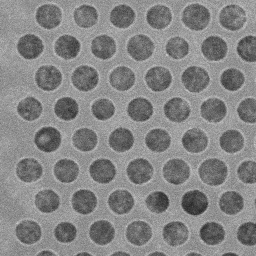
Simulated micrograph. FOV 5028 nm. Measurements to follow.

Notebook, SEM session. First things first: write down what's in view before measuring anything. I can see a regular array of holes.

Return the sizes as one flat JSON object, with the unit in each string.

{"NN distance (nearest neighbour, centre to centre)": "702 nm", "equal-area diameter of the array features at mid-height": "519 nanometers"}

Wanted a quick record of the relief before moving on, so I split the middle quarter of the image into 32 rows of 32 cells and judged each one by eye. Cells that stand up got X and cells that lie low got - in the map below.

XXXX---XXXXXXX-XXXXXXX--XXXXXXXX
XX------XXXX-----XXXX-----XXXX--
XX-------XX-------XX-------XX---
XX-------XX-------XX-------XX---
XX-------XX-------XX-------XX---
XX------XXXX-----XXXX------XXX--
XXX----XXXXXX---XXXXXX---XXXXXX-
XXXXXXXXXXXXXXXXXXXXXXXXXXXXXXXX
--XXXXXXX-XXXXXXXX---XXXXXX--XXX
---XXXX-----XXXX------XXX------X
----XXX------XXX------XXX-------
----XXX------XX--------XX-------
---XXXX------XXX------XXX------X
---XXXXX----XXXXX-----XXXX-----X
XXXXXXXXXXXXXXXXXX-XXXXXXXX---XX
XXXXXXXXXXXXXXXXXXXXXXXXXXXXXXXX
XXX----XXXXX----XXXXXX----XXXXX-
XX------XXX------XXXX-----XXXX--
XX-------XX-------XX-------XX---
XX-------XX-------XX-------XX---
XX------XXX------XXX------XXXX--
XXX----XXXXX----XXXXX-----XXXX--
XXXXXXXXXXXXXXXXXXXXXXXXXXXXXXXX
XXXXXXXXX-XXXXXXXX--XXXXXXX-XXXX
---XXXX-----XXXX-----XXXXX-----X
----XX-------XXX------XXX------X
----XX-------XXX------XX--------
----XX-------XXX------XXX-------
---XXXX------XXX------XXX------X
--XXXXXX----XXXXX----XXXXX-----X
XXXXXXXXXXXXXXXXXXXXXXXXXXXXXXXX
XXXX--XXXXXXX---XXXXXXXXXXXXXXXX